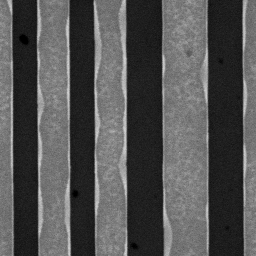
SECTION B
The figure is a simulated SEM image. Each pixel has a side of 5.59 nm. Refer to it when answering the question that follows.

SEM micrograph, groups of lines, slits or small figures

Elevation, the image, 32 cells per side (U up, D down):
UDDDDUUUUDDDUUUDDDDDUUUUUUDDDDDU
UDDDDUUUUDDDUUUDDDDDUUUUUUDDDDDU
UDDDDUUUUDDDUUUDDDDDUUUUUUDDDDDU
UDDDDUUUDDDDUUUDDDDDUUUUUUDDDDDU
UDDDDUUUDDDDUUUDDDDDUUUUUUDDDDDU
UDDDDUUUDDDDUUUDDDDDUUUUUUDDDDDU
UDDDDUUUUDDDUUUUDDDDUUUUUUDDDDUU
UDDDDUUUUDDDUUUUDDDDUUUUUUDDDDUU
UDDDDUUUUDDDUUUUDDDDUUUUUUDDDDUU
UUDDDUUUUDDDUUUDDDDDUUUUUUDDDDUU
UUDDDUUUUDDDUUUDDDDDUUUUUUDDDDDU
UDDDDUUUUDDDUUUUDDDDUUUUUUDDDDDU
UDDDDUUUUDDDUUUUDDDDUUUUUUDDDDDU
UDDDDUUUUDDDUUUUDDDDUUUUUUDDDDDU
UDDDDUUUUDDDUUUUDDDDUUUUUUDDDDUU
UDDDDUUUUDDDUUUUDDDDUUUUUUDDDDUU
UDDDDUUUUDDDUUUUDDDDUUUUUUDDDDDU
UDDDDUUUUDDDUUUUDDDDUUUUUUDDDDDU
UDDDDUUUUDDDUUUUDDDDUUUUUUDDDDDU
UDDDDUUUUDDDUUUDDDDDUUUUUUDDDDDU
UDDDDUUUUDDDUUUDDDDDUUUUUUDDDDDU
UUDDDUUUUDDDUUUDDDDDUUUUUUDDDDDU
UUDDDUUUUDDDUUUUDDDDUUUUUUDDDDDU
UUDDDUUUUDDDUUUUDDDDUUUUUUDDDDDU
UUDDDUUUDDDDUUUUDDDDDUUUUUDDDDDU
UUDDDUUUDDDDUUUUDDDDDUUUUUDDDDDU
UUDDDUUUDDDDUUUUDDDDDUUUUUDDDDDU
UUDDDUUUDDDDUUUUDDDDDUUUUUDDDDDU
UUDDDUUUUDDDUUUUDDDDDUUUUUDDDDDU
UUDDDUUUUDDDUUUUDDDDDUUUUUDDDDDU
UUDDDUUUUDDDUUUUDDDDDUUUUUDDDDDU
UUDDDUUUUDDDUUUUDDDDDUUUUUDDDDDU